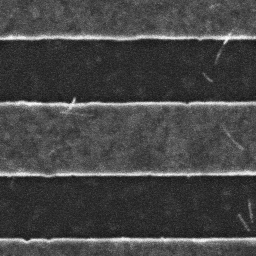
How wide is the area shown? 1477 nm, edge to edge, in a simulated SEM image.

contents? one or a few lines or trenches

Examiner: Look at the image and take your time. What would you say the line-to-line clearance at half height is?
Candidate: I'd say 373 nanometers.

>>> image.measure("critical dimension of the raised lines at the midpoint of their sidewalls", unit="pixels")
71.9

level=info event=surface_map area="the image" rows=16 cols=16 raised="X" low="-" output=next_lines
XXXXXXXXXXXXXXXX
XXXXXXXXXXXXXXXX
----------------
----------------
----------------
----------------
XXXXXXX-XXX-XXXX
XXXXXXXXXXXXXXXX
XXXXXXXXXXXXXXXX
XXXXXXXXXXXXXXXX
XXXXXXXXXXXXXXXX
----------------
----------------
----------------
----------------
XXXXXXXXXXXXXXXX